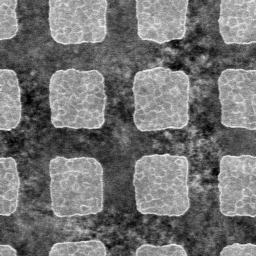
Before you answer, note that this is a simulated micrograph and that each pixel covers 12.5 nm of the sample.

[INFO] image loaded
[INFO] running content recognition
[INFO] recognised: raised bodies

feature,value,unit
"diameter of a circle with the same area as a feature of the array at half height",771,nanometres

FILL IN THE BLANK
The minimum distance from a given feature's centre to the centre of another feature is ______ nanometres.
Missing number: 1060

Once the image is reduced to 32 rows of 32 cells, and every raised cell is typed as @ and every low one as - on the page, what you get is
@@----@@@@@@@----@@@@@@-----@@@@
@@----@@@@@@@----@@@@@@-----@@@@
@@----@@@@@@@----@@@@@@----@@@@@
@@----@@@@@@@----@@@@@@----@@@@@
@@-----@@@@@@----@@@@@@-----@@@@
--------------------------------
--------------------------------
--------------------------------
--------------------------------
@@-----@@@@@@----@@@@@@-----@@@@
@@----@@@@@@@----@@@@@@@---@@@@@
@@----@@@@@@@----@@@@@@----@@@@@
@@@---@@@@@@@----@@@@@@-----@@@@
@@@---@@@@@@@----@@@@@@-----@@@@
@@----@@@@@@@----@@@@@@-----@@@@
@@-----@@@@@@----@@@@@@-----@@@@
--------------------------------
--------------------------------
--------------------------------
-------------------@@@--------@-
@@----@@@@@@-----@@@@@@-----@@@@
@@----@@@@@@@----@@@@@@-----@@@@
@@----@@@@@@@----@@@@@@----@@@@@
@@----@@@@@@@----@@@@@@----@@@@@
@@----@@@@@@@----@@@@@@-----@@@@
@@-----@@@@@@----@@@@@@@----@@@@
@@-----@@@@@------@@@@@-----@@@@
--------------------------------
--------------------------------
--------------------------------
-------@@@@@@----------------@--
@@----@@@@@@@----@@@@@@-----@@@@